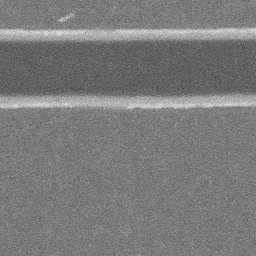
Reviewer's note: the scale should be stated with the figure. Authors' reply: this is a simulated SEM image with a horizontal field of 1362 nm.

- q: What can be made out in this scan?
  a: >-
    one or a few lines or trenches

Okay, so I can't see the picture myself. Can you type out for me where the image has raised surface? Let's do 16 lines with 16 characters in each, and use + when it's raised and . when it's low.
++++++++++++++++
++++++++++++++++
................
................
................
................
++++++++++++++++
++++++++++++++++
++++++++++++++++
++++++++++++++++
++++++++++++++++
++++++++++++++++
++++++++++++++++
++++++++++++++++
++++++++++++++++
++++++++++++++++